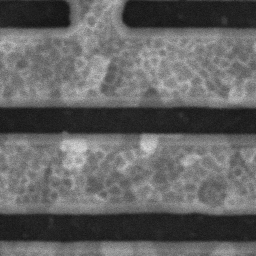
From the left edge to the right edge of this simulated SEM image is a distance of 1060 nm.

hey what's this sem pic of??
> one or a few lines or trenches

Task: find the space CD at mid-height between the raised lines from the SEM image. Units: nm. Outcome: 155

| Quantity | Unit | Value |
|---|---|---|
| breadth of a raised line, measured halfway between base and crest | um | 0.286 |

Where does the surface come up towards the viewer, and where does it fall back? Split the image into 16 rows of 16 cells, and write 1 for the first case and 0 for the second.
0000011000000000
0000011000000000
1111111111111111
1111111111111111
1111111111111111
1111111111111111
0000000000000000
0000000000000000
0000000000000000
1111111111111111
1111111111111111
1111111111111111
1111111111111111
0000000000000000
0000000000000000
1110011111111111